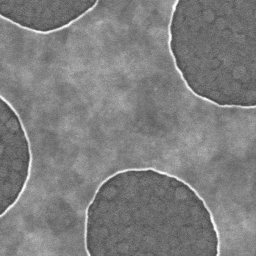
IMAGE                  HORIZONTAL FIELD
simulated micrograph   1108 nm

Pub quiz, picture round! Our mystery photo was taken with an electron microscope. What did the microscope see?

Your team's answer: holes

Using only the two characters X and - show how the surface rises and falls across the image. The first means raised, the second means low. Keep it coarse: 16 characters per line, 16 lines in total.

------XXXXX-----
X---XXXXXXX-----
XXXXXXXXXXX-----
XXXXXXXXXXX-----
XXXXXXXXXXX-----
XXXXXXXXXXXX----
XXXXXXXXXXXXXX--
-XXXXXXXXXXXXXXX
--XXXXXXXXXXXXXX
--XXXXXXXXXXXXXX
--XXXXXXXXXXXXXX
--XXXX------XXXX
-XXXXX-------XXX
XXXXX--------XXX
XXXXX--------XXX
XXXXX---------XX